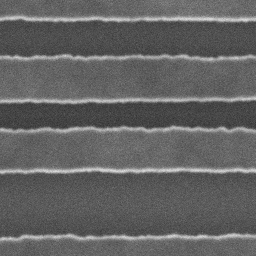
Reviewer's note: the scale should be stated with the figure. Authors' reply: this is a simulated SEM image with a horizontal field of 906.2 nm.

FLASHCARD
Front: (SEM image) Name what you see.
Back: lines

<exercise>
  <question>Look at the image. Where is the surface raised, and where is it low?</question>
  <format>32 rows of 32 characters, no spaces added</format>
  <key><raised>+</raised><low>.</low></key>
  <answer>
++++++++++++++++++++++++++++++++
++++++++++++++++++++++++++++++++
+..+++++++++.+++++++++++++++++++
................................
................................
................................
................................
++++++++++++++++++++++++++++++++
++++++++++++++++++++++++++++++++
++++++++++++++++++++++++++++++++
++++++++++++++++++++++++++++++++
++++++++++++++++++++++++++++++++
++++++++++++++++++++++++++++++++
................................
................................
................................
++++++++++++++++++++++++++++++++
++++++++++++++++++++++++++++++++
++++++++++++++++++++++++++++++++
++++++++++++++++++++++++++++++++
++++++++++++++++++++++++++++++++
+++++.+++.....++.+........++...+
................................
................................
................................
................................
................................
................................
................................
...+.+++++....++....+++..+.+++++
++++++++++++++++++++++++++++++++
++++++++++++++++++++++++++++++++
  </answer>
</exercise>